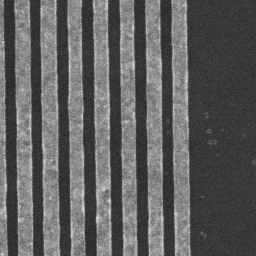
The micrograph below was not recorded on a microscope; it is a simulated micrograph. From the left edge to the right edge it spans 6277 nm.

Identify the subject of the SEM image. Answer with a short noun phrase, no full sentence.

wiring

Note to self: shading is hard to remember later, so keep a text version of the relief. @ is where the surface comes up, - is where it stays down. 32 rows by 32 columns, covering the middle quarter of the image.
-@@@----@@@---@@@----@@@---@@@@-
-@@@----@@@---@@@@---@@@---@@@@-
-@@@----@@@---@@@@---@@@---@@@@-
-@@@----@@@---@@@@---@@@---@@@@-
-@@@----@@@---@@@@---@@@---@@@--
-@@@@---@@@---@@@@---@@@---@@@--
-@@@@---@@@---@@@@---@@@---@@@--
-@@@@---@@@---@@@@---@@@---@@@@-
-@@@@---@@@---@@@@---@@@---@@@@-
-@@@@---@@@---@@@@---@@@---@@@@-
-@@@@---@@@---@@@@---@@@---@@@@-
-@@@@---@@@---@@@@---@@@---@@@@-
-@@@@---@@@---@@@@---@@@---@@@@-
-@@@@---@@@---@@@@---@@@---@@@@-
-@@@@---@@@---@@@@---@@@---@@@@-
-@@@@---@@@----@@@---@@@---@@@@-
-@@@@---@@@----@@@---@@@---@@@@-
--@@@---@@@----@@@---@@@----@@@-
--@@@---@@@----@@@---@@@----@@@-
--@@@---@@@----@@@---@@@----@@@-
--@@@---@@@----@@@---@@@----@@@-
--@@@---@@@---@@@@---@@@----@@@-
--@@@---@@@---@@@@---@@@@---@@@-
--@@@---@@@----@@@---@@@@---@@@-
--@@@---@@@----@@@---@@@@---@@@-
--@@@---@@@----@@@---@@@@---@@@-
--@@@---@@@----@@@---@@@@---@@@-
--@@@---@@@----@@@---@@@@---@@@-
--@@@---@@@----@@@---@@@@---@@@-
--@@@---@@@----@@@---@@@@---@@@-
--@@@---@@@----@@@---@@@@---@@@-
--@@@---@@@----@@@---@@@@---@@@-